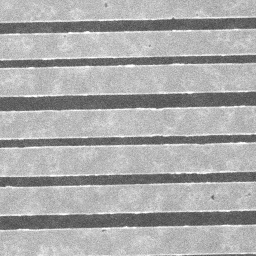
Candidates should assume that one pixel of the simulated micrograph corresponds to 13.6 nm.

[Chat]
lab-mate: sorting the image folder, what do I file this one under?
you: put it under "parallel lines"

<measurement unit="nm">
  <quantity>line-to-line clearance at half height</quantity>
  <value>144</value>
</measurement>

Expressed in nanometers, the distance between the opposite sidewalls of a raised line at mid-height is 386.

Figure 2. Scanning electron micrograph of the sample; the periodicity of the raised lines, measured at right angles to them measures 0.526 µm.